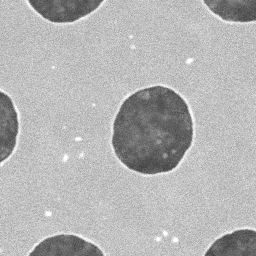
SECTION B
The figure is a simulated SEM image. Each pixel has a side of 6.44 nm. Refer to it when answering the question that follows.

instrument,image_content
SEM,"holes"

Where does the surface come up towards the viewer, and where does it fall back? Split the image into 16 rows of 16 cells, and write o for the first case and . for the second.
oo....ooooooo...
oooooooooooooooo
oooooooooooooooo
oooooooooooooooo
oooooooooooooooo
ooooooooo..ooooo
.ooooooo....oooo
.oooooo.....oooo
.oooooo.....oooo
.oooooo.....oooo
oooooooo...ooooo
oooooooooooooooo
oooooooooooooooo
oooooooooooooooo
ooooooooooooooo.
oo....ooooooo...